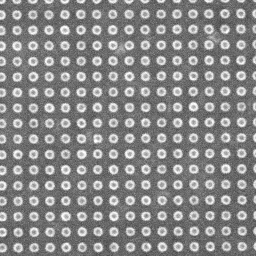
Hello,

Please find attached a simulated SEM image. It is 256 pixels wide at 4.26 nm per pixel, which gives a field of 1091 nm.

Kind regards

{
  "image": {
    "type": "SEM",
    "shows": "a regular array of raised bodies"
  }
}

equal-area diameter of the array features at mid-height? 32.9 nanometres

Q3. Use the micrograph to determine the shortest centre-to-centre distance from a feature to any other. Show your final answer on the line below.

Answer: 65.7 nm